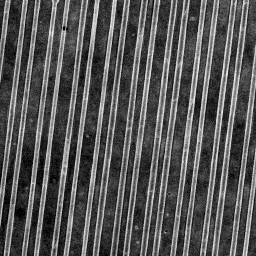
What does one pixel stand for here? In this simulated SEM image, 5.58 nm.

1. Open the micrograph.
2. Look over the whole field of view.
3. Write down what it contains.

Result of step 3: parallel lines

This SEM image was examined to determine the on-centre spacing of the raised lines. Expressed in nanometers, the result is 82.3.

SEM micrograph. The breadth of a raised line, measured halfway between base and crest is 30.4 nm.